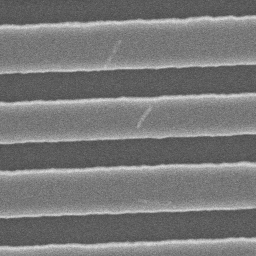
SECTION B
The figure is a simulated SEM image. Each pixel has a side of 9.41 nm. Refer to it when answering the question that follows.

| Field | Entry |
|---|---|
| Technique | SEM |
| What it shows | lines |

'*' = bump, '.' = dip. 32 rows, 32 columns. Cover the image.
................................
................................
....................************
********************************
********************************
********************************
********************************
********************************
******************.*............
................................
................................
................................
..........**********************
********************************
********************************
********************************
********************************
**********......................
................................
................................
...........................*****
********************************
********************************
********************************
********************************
********************************
*****************...............
................................
................................
................................
.............*******************
********************************